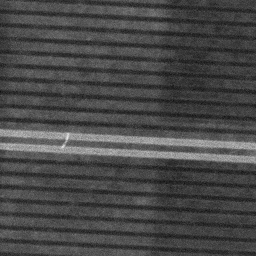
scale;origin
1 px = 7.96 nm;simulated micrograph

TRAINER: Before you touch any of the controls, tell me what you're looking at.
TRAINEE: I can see parallel lines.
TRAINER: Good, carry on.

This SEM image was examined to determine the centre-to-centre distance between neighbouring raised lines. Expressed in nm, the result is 107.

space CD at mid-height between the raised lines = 61.6 nm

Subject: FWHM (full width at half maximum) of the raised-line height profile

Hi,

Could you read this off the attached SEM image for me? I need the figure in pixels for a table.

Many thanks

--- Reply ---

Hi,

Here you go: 5.87